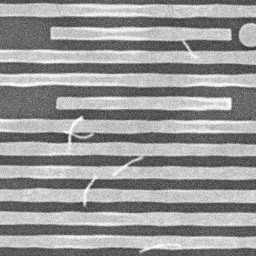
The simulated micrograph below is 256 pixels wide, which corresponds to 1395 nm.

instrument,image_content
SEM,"groups of lines, slits or small figures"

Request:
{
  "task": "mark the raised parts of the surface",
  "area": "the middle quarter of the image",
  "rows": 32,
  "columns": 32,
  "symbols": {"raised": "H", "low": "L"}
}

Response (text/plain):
LLLLLLLLLLLLLLLLLLLLLLLLLLLLLLLL
LLLLLLLLLLLLLLLLLLLLLLLLLLLLLLLL
LLLLLLLLLLLLLLLLLLHHHHHLLLLLLLLL
HHHHHHHHHHHHHHHHHHHHHHHHHHHHHHHH
HHHHHHHHHHHHHHHHHHHHHHHHHHHHHHHH
LLLLLLLLLLLLLLLLLLLLLLLLLLLLLLLL
LLLLLLLLLLLLLLLLLLLLLLLLLLLLLLLL
LLLLLLLLLLLLLLLLLLLLLLLLLLLLLLLL
LLLLLLLLLLLLLLLLLLHHHHLHHHHHHHLL
HHHHHHHHHHHHHHHHHHHHHHHHHHHHHHHH
HHHHHHHHHHHHHHHHHHHHHHHHHHHHHHHH
LLLLLLLLLLLLLLLLLLLLLLLLLLLLLLLL
LLLLLLLLLLLLLLLLLLLLLLLLLLLLLLLL
LLLLLLLLLLLLLLLLLLLLLLLLLLLLLLLL
HHHHHHHHHHHHHHHHHHHHHHHHHHHHHHLL
HHHHHHHHHHHHHHHHHHHHHHHHHHHHHHHH
HHHHHHHHHHHHHHHHHHHHHHHHHHHHHHHH
LHLLLLLLLLLLLLLLLLLLLLLLLLLLLLLL
LLLLLLLLLLLLLLLLLLLLLLLLLLLLLLLL
LHLLLLLLLLLLLLLLLLLLLLLLLLLLLLLL
HHHHHHHHHHHHHHHHHHHHHHHHHHHHHHHH
HHHHHHHHHHHHHHHHHHHHHHHHHHHHHHHH
LLHHHHHLLHHHHHHHHHHHHHHHHHHHHHHH
LLLLLLLLLLLLLLLLLLLLLLLLLLLLLLLL
LLLLLLLLLLLLLLLLLLLLLLLLLLLLLLLL
LLLLLLLLLLLLLLLHLLLLLLLLLLLLLLLL
HHHHHHHHHHHHHHHHHHHHHHHHHHHHHHHH
HHHHHHHHHHHHHHHHHHHHHHHHHHHHHHHH
LLHHHHHHHHHHHHHHHHHHHHLHHHHHHHHH
LLLLLLLLLLLLLLLLLLLLLLLLLLLLLLLL
LLLLLLLLLLLLLLLLLLLLLLLLLLLLLLLL
HHLLLHHHHHHHHLLLLLLLLLLLLLLLLLLL